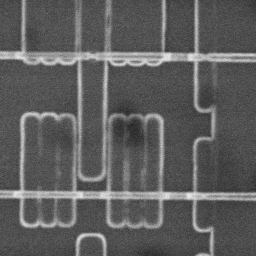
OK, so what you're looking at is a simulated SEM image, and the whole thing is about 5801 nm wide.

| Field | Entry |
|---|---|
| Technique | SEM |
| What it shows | wiring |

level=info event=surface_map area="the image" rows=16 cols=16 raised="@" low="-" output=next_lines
-@@@@@@@@@--@@@@
-@@@@@@@@@--@@@@
-@@@@@@@@@--@@@@
-@@@@@@@@@@-@@@@
-----@@-----@@@@
-----@@-----@@@@
-----@@-----@@@@
-@@@@@@@@@---@@@
-@@@@@@@@@---@@@
-@@@@@@@@@--@@@@
-@@@@@@@@@--@@@@
-@@@@--@@@--@@@@
-@@@@--@@@--@@@@
-@@@@--@@@--@@@@
-------------@@@
-----@@------@@@